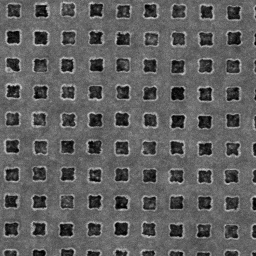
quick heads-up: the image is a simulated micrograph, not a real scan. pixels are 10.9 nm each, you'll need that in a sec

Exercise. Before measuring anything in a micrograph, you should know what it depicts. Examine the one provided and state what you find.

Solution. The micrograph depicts a regular array of holes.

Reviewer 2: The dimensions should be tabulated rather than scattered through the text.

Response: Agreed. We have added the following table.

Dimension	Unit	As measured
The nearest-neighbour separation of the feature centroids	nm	291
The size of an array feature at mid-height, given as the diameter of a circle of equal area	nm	160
